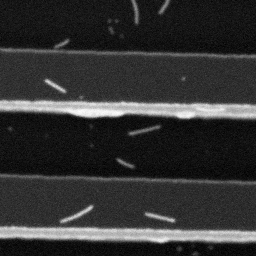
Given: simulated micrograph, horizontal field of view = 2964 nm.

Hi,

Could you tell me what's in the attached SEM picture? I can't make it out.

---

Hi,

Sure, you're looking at lines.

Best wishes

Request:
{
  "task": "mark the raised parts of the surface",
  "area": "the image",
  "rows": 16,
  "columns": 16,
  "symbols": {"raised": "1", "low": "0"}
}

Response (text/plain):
0000000000000000
0000000000000000
0000000000000000
1111111111111100
1111111111111111
1111111111111111
1111111111111111
0000000000000000
0000000000000000
0000000000000000
0000000000000000
1111111111111111
1111111111111111
1111111111111111
1111111111111111
0000000000000000